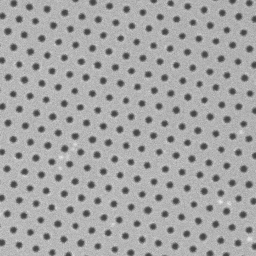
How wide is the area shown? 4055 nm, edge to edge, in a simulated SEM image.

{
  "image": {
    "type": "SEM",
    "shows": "a regular array of holes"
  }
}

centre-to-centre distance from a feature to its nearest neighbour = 260 nm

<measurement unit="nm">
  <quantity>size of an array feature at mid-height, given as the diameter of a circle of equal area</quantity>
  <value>114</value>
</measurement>